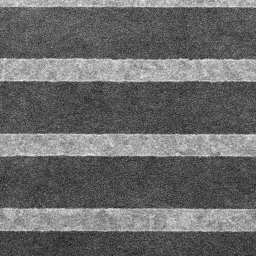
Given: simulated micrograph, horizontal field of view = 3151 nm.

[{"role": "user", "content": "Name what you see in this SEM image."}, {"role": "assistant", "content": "one or a few lines or trenches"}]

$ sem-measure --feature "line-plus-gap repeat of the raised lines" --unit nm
920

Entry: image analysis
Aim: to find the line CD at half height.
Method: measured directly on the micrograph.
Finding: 262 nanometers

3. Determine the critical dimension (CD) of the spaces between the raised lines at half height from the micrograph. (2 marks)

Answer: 658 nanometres